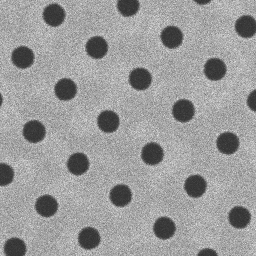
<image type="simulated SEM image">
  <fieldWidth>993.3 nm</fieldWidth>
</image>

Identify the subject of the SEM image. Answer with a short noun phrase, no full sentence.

a regular array of holes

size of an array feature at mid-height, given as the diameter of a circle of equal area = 85.5 nm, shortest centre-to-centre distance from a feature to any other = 203 nm